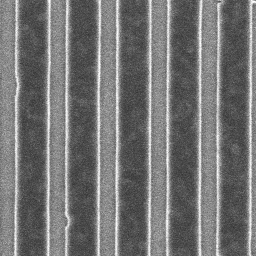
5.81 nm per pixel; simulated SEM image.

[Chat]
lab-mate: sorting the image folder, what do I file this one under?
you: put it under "parallel lines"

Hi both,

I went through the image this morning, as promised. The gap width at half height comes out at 100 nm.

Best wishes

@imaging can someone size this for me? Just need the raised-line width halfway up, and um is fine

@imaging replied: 0.195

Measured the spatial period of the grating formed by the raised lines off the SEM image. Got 293 nanometres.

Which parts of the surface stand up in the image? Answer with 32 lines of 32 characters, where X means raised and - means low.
--XXXX--XXXX---XXXX--XXXX--XXXXX
--XXXX--XXXX---XXXX--XXXX--XXXX-
--XXXX--XXXX---XXXX--XXXX--XXXX-
--XXXX--XXXX---XXXX--XXXX--XXXX-
--XXXX--XXXX---XXXX--XXXX--XXXX-
--XXXX--XXXX---XXXX--XXXX--XXXX-
--XXXX--XXXX---XXXX--XXXX--XXXX-
--XXXX--XXXX---XXXX--XXXX--XXXX-
--XXXX--XXXX---XXXX--XXXX--XXXX-
--XXXX--XXXX---XXXX--XXXX--XXXX-
--XXXX--XXXX---XXXX--XXXX--XXXX-
--XXXX--XXXX---XXXX--XXXX--XXXX-
--XXXX--XXXX---XXXX--XXXX--XXXX-
--XXXX--XXXX---XXXX--XXXX--XXXX-
--XXXX--XXXX---XXXX--XXXX--XXXX-
--XXXX--XXXX---XXXX--XXXX--XXXX-
--XXXX--XXXX---XXXX--XXXX--XXXX-
--XXXX--XXXX---XXXX--XXXX--XXXX-
--XXXX--XXXX---XXXX--XXXX--XXXX-
--XXXX--XXXX---XXXX--XXXX--XXXX-
--XXXX--XXXX---XXXX--XXXX--XXXX-
--XXXX--XXXX---XXXX--XXXX--XXXX-
--XXXX--XXXX---XXXX--XXXX--XXXX-
--XXXX--XXXX---XXXX--XXXX--XXXX-
--XXXX--XXXX---XXXX--XXXX--XXXX-
--XXXX--XXXX---XXXX--XXXX--XXXX-
--XXXX--XXXX---XXXX--XXXX--XXXX-
--XXXX--XXXX---XXXX--XXXX--XXXX-
--XXXX--XXXX---XXXX--XXXX--XXXX-
--XXXX--XXXX---XXXX--XXXX--XXXX-
--XXXX--XXXX---XXXX--XXXX--XXXX-
--XXXX--XXXX---XXXX--XXXX--XXXX-